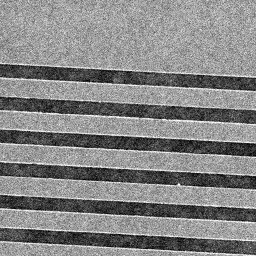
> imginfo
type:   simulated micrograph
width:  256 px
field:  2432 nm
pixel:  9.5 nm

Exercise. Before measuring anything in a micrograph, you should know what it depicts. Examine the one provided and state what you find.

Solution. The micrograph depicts parallel lines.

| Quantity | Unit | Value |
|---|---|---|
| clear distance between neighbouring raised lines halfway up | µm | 0.136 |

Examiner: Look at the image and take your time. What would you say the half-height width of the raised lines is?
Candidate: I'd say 18.6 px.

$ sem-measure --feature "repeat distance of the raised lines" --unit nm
311